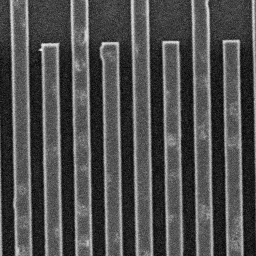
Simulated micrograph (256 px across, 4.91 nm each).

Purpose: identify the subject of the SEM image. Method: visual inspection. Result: parallel lines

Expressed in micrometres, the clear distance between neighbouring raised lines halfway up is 0.0687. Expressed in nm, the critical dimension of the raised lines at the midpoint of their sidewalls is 78.6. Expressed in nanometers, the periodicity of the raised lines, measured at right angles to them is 148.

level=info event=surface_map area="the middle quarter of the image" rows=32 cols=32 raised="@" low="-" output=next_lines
--@@@@----@@@@---@@@@----@@@@---
--@@@@----@@@@---@@@@----@@@@---
--@@@@----@@@@---@@@@----@@@@---
--@@@@----@@@@---@@@@----@@@@---
--@@@@----@@@@---@@@@----@@@@---
--@@@@----@@@@---@@@@----@@@@---
--@@@@----@@@@---@@@@----@@@@---
--@@@@----@@@@----@@@----@@@@---
--@@@@----@@@@----@@@----@@@@---
--@@@@----@@@@----@@@----@@@@---
--@@@@----@@@@----@@@----@@@@---
--@@@@----@@@@----@@@----@@@@---
--@@@@----@@@@----@@@----@@@@---
--@@@@----@@@@----@@@----@@@@---
--@@@@----@@@@----@@@----@@@@---
--@@@@----@@@@----@@@----@@@@---
---@@@----@@@@----@@@----@@@@---
---@@@----@@@@----@@@----@@@@---
---@@@----@@@@----@@@----@@@@---
--@@@@----@@@@----@@@----@@@@---
--@@@@----@@@@----@@@----@@@@---
--@@@@@---@@@@----@@@@---@@@@---
---@@@@---@@@@----@@@@---@@@@---
---@@@@---@@@@----@@@@---@@@@---
---@@@@---@@@@----@@@@---@@@@---
---@@@@---@@@@----@@@@----@@@---
---@@@@---@@@@----@@@@---@@@@---
---@@@@---@@@@----@@@@---@@@@---
---@@@@---@@@@----@@@@---@@@@---
---@@@@---@@@@----@@@@---@@@@---
---@@@@---@@@@----@@@@---@@@@---
---@@@@---@@@@----@@@@---@@@@---